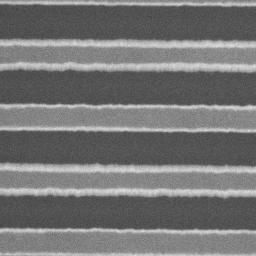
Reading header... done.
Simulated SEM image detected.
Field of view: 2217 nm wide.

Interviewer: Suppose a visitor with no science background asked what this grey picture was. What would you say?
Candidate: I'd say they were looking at lines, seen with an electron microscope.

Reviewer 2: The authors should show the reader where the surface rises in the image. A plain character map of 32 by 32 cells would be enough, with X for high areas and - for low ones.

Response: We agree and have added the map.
-XXX-XXXXXXXXXXXXXXXXXXXXXXXXXXX
--------------------------------
--------------------------------
--------------------------------
--------------------------------
XXXXXXXXXXXXXXXXXXXXXXXXXXXXXXXX
XXXXXXXXXXXXXXXXXXXXXXXXXXXXXXXX
XXXXXXXXXXXXXXXXXXXXXXXXXXXXXXXX
XXXXXXXXXXXXXXXXXXXXXXXXXXXXXXXX
--------------------------------
--------------------------------
--------------------------------
--------------------------------
XXXXXXXXXXXXXXXXXXXXXXXXXXXXXXXX
XXXXXXXXXXXXXXXXXXXXXXXXXXXXXXXX
XXXXXXXXXXXXXXXXXXXXXXXXXXXXXXXX
--------------------------------
--------------------------------
--------------------------------
--------------------------------
--------------------------------
XXXXXXXXXXXXXXXXXXXXXXXXXXXXXXXX
XXXXXXXXXXXXXXXXXXXXXXXXXXXXXXXX
XXXXXXXXXXXXXXXXXXXXXXXXXXXXXXXX
--------------------------------
--------------------------------
--------------------------------
--------------------------------
--------------------------------
XXXXXXXXXXXXXXXXXXXXXXXXXXXXXXXX
XXXXXXXXXXXXXXXXXXXXXXXXXXXXXXXX
XXXXXXXXXXXXXXXXXXXXXXXXXXXXXXXX